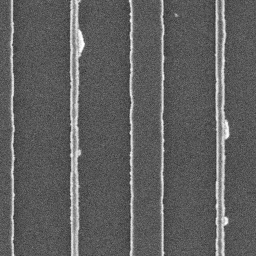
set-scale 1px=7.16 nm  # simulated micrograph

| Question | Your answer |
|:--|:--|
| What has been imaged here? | lines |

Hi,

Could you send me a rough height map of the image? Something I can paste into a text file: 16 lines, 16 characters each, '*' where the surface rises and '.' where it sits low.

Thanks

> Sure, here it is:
*.......**......
*.......**......
*...*...**......
*.......**......
*.......**......
*.......**......
*.......**......
*.......**......
*.......**......
*.......**......
*.......**......
*.......**......
*.......**......
*.......**......
*.......**......
*.......**......